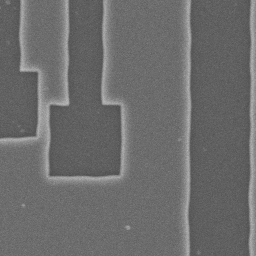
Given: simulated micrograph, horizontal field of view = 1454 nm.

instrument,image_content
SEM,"groups of lines, slits or small figures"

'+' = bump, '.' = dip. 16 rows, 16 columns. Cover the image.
.+++...+++++....
.+++..++++++....
.+++..++++++....
.+++...+++++....
..++..++++++....
..++..++++++....
..++...+++++....
..+.....++++....
..+.....++++....
+++.....++++....
+++.....++++....
++++++++++++....
++++++++++++....
++++++++++++....
++++++++++++....
++++++++++++....